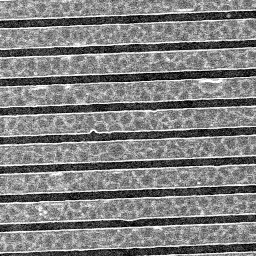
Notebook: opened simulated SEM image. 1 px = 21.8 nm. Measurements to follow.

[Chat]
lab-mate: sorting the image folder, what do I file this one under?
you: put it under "parallel lines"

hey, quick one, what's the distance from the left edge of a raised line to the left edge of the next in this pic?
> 635 nanometres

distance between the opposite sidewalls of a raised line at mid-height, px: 20.9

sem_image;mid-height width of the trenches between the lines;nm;188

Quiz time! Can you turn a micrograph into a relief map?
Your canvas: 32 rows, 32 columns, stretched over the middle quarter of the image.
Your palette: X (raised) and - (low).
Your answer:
XXXXXXXXXXXXXXXXXXXXXXXXXXXXXXXX
XXXXXXXXXXXXXXXXXXXXXXXXXXXXXXXX
XXXXXXX--X----------------------
--------------------------------
-----------------XXXXXXXXXXXXXXX
XXXXXXXXXXXXXXXXXXXXXXXXXXXXXXXX
XXXXXXXXXXXXXXXXXXXXXXXXXXXXXXXX
XXXXXXXXXXXXXXXXXXXXXXXXXXXXXXXX
XXXXXXXXXXXXXXXXXXXXXXXXXXXXXXXX
XXXXXXXXXXXXXXXXX----X----------
--------------------------------
---------------------------XXXXX
--XXXXXXXXXXXXXXXXXXXXXXXXXXXXXX
XXXXXXXXXXXXXXXXXXXXXXXXXXXXXXXX
XXXXXXXXXXXXXXXXXXXXXXXXXXXXXXXX
XXXXXXXXXXXXXXXXXXXXXXXXXXXXXXXX
XXXXXXXXXXXXXXXXXXXXXXXXXXX-----
--------------------------------
--------------------------------
--------XX-XXXXXXXXXXXXXXXXXXXXX
XXXXXXXXXXXXXXXXXXXXXXXXXXXXXXXX
XXXXXXXXXXXXXXXXXXXXXXXXXXXXXXXX
XXXXXXXXXXXXXXXXXXXXXXXXXXXXXXXX
XXXXXXXXXXXXXXXXXXXXXXXXXXXXXXXX
XXXXXX--------------------------
--------------------------------
---------------XXXXXXXXXXXXXXXXX
XXXXXXXXXXXXXXXXXXXXXXXXXXXXXXXX
XXXXXXXXXXXXXXXXXXXXXXXXXXXXXXXX
XXXXXXXXXXXXXXXXXXXXXXXXXXXXXXXX
XXXXXXXXXXXXXXXXXXXXXXXXXXXXXXXX
XXXXXXXXXX--X-------------------